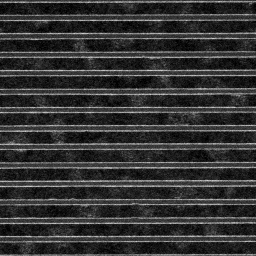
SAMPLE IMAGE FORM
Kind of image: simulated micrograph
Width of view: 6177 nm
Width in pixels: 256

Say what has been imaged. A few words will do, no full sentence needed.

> parallel lines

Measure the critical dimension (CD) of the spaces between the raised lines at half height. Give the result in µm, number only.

0.124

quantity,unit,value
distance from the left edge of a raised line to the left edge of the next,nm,445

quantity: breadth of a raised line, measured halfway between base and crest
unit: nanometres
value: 329